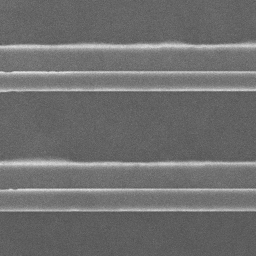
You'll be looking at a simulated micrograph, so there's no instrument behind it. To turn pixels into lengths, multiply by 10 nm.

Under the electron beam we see lines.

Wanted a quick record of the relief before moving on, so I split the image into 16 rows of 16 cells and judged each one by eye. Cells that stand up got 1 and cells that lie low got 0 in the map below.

0000000000000000
0000000000000000
0000000000000000
1111111111111111
1111111111111111
1111111111111111
0000000000000000
0000000000000000
0000000000000000
0000000000000000
1111111111111111
1111111111111111
1111111111111111
0000000000000000
0000000000000000
0000000000000000